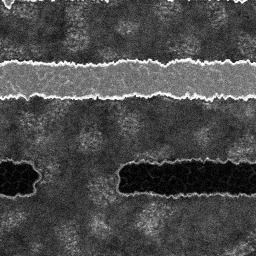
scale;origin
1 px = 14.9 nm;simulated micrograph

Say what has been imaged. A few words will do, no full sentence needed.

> one or a few lines or trenches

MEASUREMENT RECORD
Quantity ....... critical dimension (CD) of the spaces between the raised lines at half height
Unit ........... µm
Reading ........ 0.932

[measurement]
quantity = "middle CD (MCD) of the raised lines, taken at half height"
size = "505 nanometers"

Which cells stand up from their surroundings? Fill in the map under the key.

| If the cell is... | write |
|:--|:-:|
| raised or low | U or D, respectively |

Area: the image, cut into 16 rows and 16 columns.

DDDDDDDDDDDDDDDD
DDDDDDDDDDDDDDDD
DDDDDDDDDDDDDDDD
DDDDDDDDDDDDDDDD
UUUUUUUUUUUUUUUU
UUUUUUUUUUUUUUUU
DDDDDDDDDDDDDDDD
DDDDDDDDDDDDDDDD
DDDDDDDDDDDDDDDD
DDDDDDDDDDDDDDDD
UUDDDDDDUUUUUUUU
UUDDDDDUUUUUUUUU
DDDDDDDDDDDDDDDD
DDDDDDDDDDDDDDDD
DDDDDDDDDDDDDDDD
DDDDDDDDDDDDDDDD